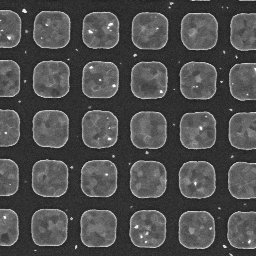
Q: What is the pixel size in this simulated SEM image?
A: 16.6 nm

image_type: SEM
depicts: a regular array of raised bodies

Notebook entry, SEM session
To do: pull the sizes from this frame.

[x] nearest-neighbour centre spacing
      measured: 815 nm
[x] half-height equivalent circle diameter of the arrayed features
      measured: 39 pixels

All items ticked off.